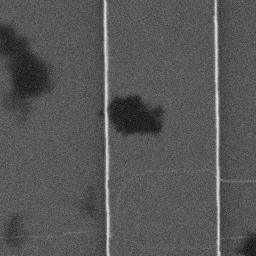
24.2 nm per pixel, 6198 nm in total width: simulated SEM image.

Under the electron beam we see wiring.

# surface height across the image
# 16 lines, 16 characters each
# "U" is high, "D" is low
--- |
DDDDDDDUUUUUUDDD
DDDDDDDUUUUUUDDD
DDDDDDDUUUUUUDDD
DDDDDDDUUUUUUUDD
DDDDDDDUUUUUUUDD
DDDDDDDUUUUUUUDD
DDDDDDDUUUUUUUDD
DDDDDDDUUUUUUUDD
DDDDDDDUUUUUUUDD
DDDDDDDUUUUUUUDD
DDDDDDDUUUUUUUDD
DDDDDDDUUUUUUUDD
DDDDDDDUUUUUUUDD
DDDDDDDUUUUUUUDD
DDDDDDDUUUUUUUDD
DDDDDDDUUUUUUUDD